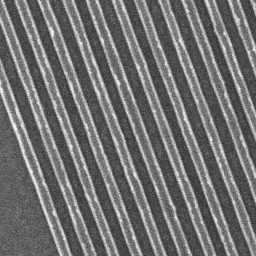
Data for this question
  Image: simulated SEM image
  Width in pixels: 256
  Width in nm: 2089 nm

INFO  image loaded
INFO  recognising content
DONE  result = parallel lines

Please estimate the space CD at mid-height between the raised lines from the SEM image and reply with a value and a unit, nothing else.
0.104 µm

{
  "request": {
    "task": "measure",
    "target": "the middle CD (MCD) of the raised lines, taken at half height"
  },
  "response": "80.5 nanometers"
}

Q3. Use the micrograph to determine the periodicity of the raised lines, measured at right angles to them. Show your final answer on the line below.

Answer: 182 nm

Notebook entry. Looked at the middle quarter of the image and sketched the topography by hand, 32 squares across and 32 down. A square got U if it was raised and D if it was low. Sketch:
UUDDDDUUDDDUUUDDDDUUUDDDUUDDDDUU
UUDDDDUUUDDDUUUDDDUUUDDDUUDDDDUU
UUUDDDUUUDDDUUUDDDDUUDDDUUUDDDUU
DUUDDDDUUDDDDUUDDDDUUDDDDUUDDDDU
DUUDDDDUUUDDDUUUDDDUUUDDDUUDDDDU
DUUUDDDUUUDDDUUUDDDDUUDDDUUUDDDU
DDUUDDDDUUDDDDUUUDDDUUUDDDUUDDDD
DDUUUDDDUUUDDDUUUDDDDUUDDDUUUDDD
DDDUUDDDDUUDDDUUUDDDDUUDDDDUUDDD
DDDUUDDDDUUUDDDUUUDDDUUUDDDUUDDD
DDDUUUDDDUUUDDDUUUDDDDUUDDDUUUDD
DDDDUUDDDDUUDDDUUUDDDDUUDDDDUUDD
UDDDUUUDDDUUUDDDUUUDDDUUUDDDUUDD
UDDDUUUDDDUUUDDDUUUDDDDUUDDDUUUD
UDDDDUUDDDDUUDDDDUUDDDDUUUDDDUUD
UUDDDUUDDDDUUUDDDUUUDDDDUUDDDUUD
UUDDDDUUDDDDUUDDDUUUDDDDUUDDDUUU
UUDDDDUUDDDDUUUDDDUUUDDDUUUDDDUU
UUUDDDUUUDDDUUUDDDUUUDDDDUUDDDUU
DUUDDDDUUDDDDUUDDDUUUDDDDUUUDDUU
DUUDDDDUUDDDDUUUDDDUUUDDDUUUDDDU
DUUUDDDUUUDDDUUUDDDUUUDDDDUUDDDU
DDUUDDDDUUDDDDUUDDDUUUDDDDUUUDDD
DDUUUDDDUUUDDDUUUDDDUUUDDDUUUDDD
DDDUUDDDUUUDDDUUUDDDUUUDDDDUUDDD
DDDUUUDDDUUDDDDUUDDDDUUUDDDUUUDD
DDDUUUDDDUUDDDDUUUDDDUUUDDDDUUDD
UDDDUUDDDUUUDDDDUUDDDDUUDDDDUUDD
UDDDUUUDDDUUDDDDUUDDDDUUUDDDUUUD
UDDDUUUDDDUUUDDDUUUDDDUUUDDDDUUD
UUDDDUUDDDDUUDDDDUUDDDDUUDDDDUUU
UUDDDUUDDDDUUUDDDUUUDDDUUUDDDDUU